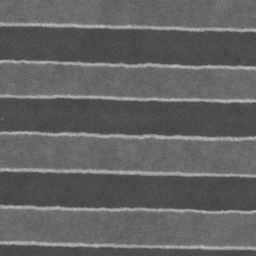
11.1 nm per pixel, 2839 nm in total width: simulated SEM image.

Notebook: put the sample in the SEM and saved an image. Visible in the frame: lines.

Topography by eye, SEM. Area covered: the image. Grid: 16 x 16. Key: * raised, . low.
****************
****************
................
................
****************
****************
................
................
**********......
****************
****************
................
................
****************
****************
...........*****